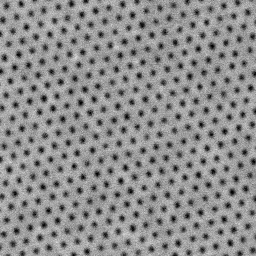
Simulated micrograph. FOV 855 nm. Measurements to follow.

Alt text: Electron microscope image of a regular array of holes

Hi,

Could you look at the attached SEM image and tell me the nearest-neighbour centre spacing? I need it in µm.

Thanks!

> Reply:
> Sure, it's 0.0452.